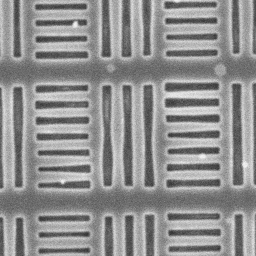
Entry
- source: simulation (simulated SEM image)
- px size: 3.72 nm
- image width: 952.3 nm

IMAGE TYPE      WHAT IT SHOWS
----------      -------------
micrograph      groups of lines, slits or small figures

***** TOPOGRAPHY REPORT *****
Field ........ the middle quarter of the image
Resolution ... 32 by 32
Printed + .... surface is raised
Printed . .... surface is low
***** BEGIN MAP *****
++++++++++++++++++++++++++++++++
++++++++++++++++++++++++++++++++
++++++++++++++++++++++++++++++++
++++++++++++++++++++++++++++++++
+++++++++++++++++++++++++.......
......+++...+++..+++..+++.......
......+++...++...+++..+++.......
+++++++++...++...+++..++++++++++
+++++++++...++...+++..++++......
......+++...++...+++...++.......
......+++...+++..+++...++.......
+++++++++...+++..+++...+++++++++
+++++++++...+++..+++..++++++++++
......+++...+++..+++..+++.......
......++++..+++..+++..++++......
++++++++++..+++..+++..++++++++++
++++++++++..+++..+++..++++++++++
......++++..+++..+++..++++......
......++++..+++..+++..++++......
++++++++++..+++..+++..++++++++++
+++++++++...+++..+++..++++++++++
......+++...++...+++..++++......
.......++...++...+++..++++......
+++++++++...++...+++..++++++++++
+++++++++....+...+++..++++++++++
.......++...+++..+++...++.......
.......++...+++..+++...+++......
+++++++++...+++..+++...+++++++++
+++++++++...+++..+++...+++++++++
.......+++..+++..+++...++.......
.......+++..+++..+++...+++......
++++++++++++++++++++++++++++++++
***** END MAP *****